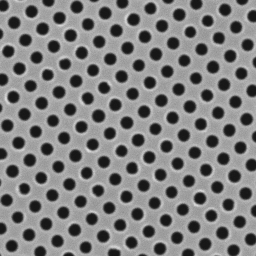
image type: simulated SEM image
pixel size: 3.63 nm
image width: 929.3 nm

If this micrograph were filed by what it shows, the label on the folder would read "a regular array of holes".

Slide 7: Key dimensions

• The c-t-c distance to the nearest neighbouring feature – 20.4 px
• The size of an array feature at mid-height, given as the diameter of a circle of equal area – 44.9 nanometers